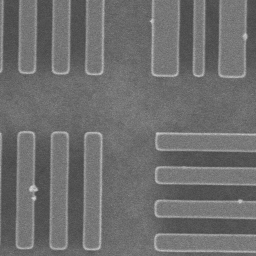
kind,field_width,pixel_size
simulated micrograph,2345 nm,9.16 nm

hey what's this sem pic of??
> groups of lines, slits or small figures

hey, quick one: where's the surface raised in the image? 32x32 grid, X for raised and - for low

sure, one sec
--XXX--XX--XX------XXX--XX-XXXX-
--XXX--XX--XX------XXX--XX-XXXX-
--XXX--XX--XX------XXX--XX-XXXX-
--XXX--XX--XX------XXX--XX-XXXX-
--XXX--XX--XX------XXX--XX-XXXX-
--XX---XX--XX------XXX--XX-XXXX-
--XX---XX--XX------XXX--X--XXXX-
--XX---XX--XX------XXX--X--XXXX-
--XX---XX--XX------XXX--X--XXXX-
----------------------------XX--
--------------------------------
--------------------------------
--------------------------------
--------------------------------
--------------------------------
--------------------------------
---X----------------------------
--XX--XX---XX-------XXXXXXXXXXXX
--XX--XX---XX-------XXXXXXXXXXXX
--XX--XX---XX-------------------
--XX--XX---XX-------------------
--XX--XX---XX------XXXXXXXXXXXXX
--XX--XX---XX-------XXXXXXXXXXXX
--XXX-XX---XX-------------------
--XX--XX---XX-------------------
--XX--XX---XX------XXXXXXXXXXXXX
--XX--XX--XXX------XXXXXXXXXXXXX
--XX--XX--XXX-------------------
--XX--XX--XXX-------------------
--XX--XX--XXX-------XXXXXXXXXXXX
--XX--XX--XXX------XXXXXXXXXXXXX
--------------------------------